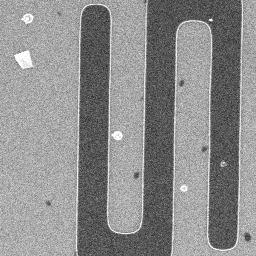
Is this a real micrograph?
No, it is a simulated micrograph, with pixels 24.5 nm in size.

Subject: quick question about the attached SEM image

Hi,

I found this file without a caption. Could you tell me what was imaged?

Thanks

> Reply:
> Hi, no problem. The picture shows groups of lines, slits or small figures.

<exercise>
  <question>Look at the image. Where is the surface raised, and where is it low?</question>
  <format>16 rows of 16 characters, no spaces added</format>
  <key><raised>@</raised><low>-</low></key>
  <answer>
-----@@--@@@@@@-
-----@@--@@@-@@-
-----@@--@@--@@-
-@---@@--@@--@@-
-----@@--@@--@@-
-----@@--@@--@@-
-----@@--@@--@@-
-----@@--@@--@@-
-----@@--@@--@@-
-----@@--@@--@@-
-----@@--@@--@@-
-----@@--@@--@@-
-----@@--@@--@@-
-----@@--@@--@@-
-----@@-@@@--@@-
-----@@@@@@--@--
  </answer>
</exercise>